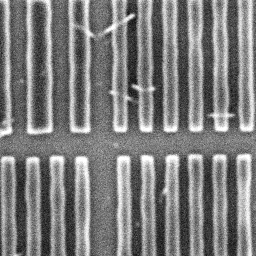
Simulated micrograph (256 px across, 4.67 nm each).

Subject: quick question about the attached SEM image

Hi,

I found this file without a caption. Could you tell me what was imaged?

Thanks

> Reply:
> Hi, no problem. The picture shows groups of lines, slits or small figures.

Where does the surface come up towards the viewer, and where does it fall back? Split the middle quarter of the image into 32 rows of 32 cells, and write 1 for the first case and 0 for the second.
00111100000001110001110001110001
00111100000011110001110001110001
00111100000011110001110001110001
00111100000011110001110001110001
00111100000011110001110001110001
00111100000011110011110001110001
00111100000011110001110001110001
00111100000011110001110001110000
00111100000001110001110001110000
00111100000001110001110001110000
00111100000001110001110001110000
00111100000001110001110001110000
00111100000001110001110001110001
00111100000001110001110001110001
00111100000001110001110001110001
00111100000001110001110001110000
00111100000001100000110001110000
00000000000000000000000000000000
00000000000000000000000000000000
00000000000000000000000000000000
00000000000000000000000000000000
00000000000000000000000000000000
00000000000000000000000000000000
00000000000000110000110000110001
00011100000000110000110000110001
00011100000000110000110000111001
00011100000000110000110000110001
00011100000000110000110000110001
00011100000000110000110000110000
00011100000000110000110000110000
00011100000000110000110000110000
00011100000000110000110001110000